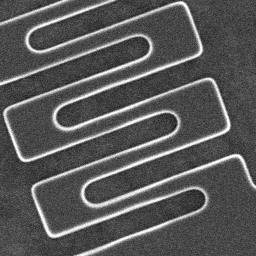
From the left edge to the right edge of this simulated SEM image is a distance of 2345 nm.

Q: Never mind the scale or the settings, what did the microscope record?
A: groups of lines, slits or small figures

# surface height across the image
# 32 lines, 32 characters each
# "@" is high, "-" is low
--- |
-------@@@@@@---------@---------
----@@@@@@---------@@@@@--------
-@@@@@@---------@@@@@@@@--------
@@@@@--------@@@@@@@@@@@--------
@@@@-------@@@@@@@@@@@@@@-------
@@@@----@@@@@@-----@@@@@@-------
@@@@@@@@@@@--------@@@@@@-------
@@@@@@@@@--------@@@@@@---------
@@@@@@---------@@@@@------------
@@@---------@@@@@@--------------
---------@@@@@@---------@@@-----
------@@@@@@---------@@@@@@-----
---@@@@@@@--------@@@@@@@@@@----
-@@@@@@---------@@@@@@@@@@@@----
-@@@@@@------@@@@@@---@@@@@@----
-@@@@@@---@@@@@@------@@@@@@@---
-@@@@@@@@@@@@@--------@@@@@@----
--@@@@@@@@@---------@@@@@@------
--@@@@@@---------@@@@@@---------
--@@@---------@@@@@@---------@--
-----------@@@@@@---------@@@@@-
--------@@@@@@---------@@@@@@@@-
------@@@@@@---------@@@@@@@@@@-
----@@@@@@@-------@@@@@@@@@@@@@@
----@@@@@@-----@@@@@@-----@@@@@@
-----@@@@@@--@@@@@--------@@@@@@
-----@@@@@@@@@@@--------@@@@@@@@
-----@@@@@@@@---------@@@@@@@@@@
------@@@@---------@@@@@@@@@@@@@
----------------@@@@@@@@@@@@@@@@
--------------@@@@@@@@@@@@@@@@@@
-----------@@@@@@@@@@@@@@@@@@@@@